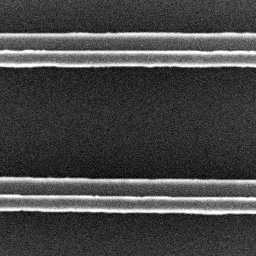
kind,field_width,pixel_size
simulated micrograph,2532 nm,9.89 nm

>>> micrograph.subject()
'lines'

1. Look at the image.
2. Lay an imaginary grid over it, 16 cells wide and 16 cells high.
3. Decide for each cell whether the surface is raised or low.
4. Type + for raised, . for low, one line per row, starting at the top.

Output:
................
................
++++++++++++++++
++++++++++++++++
................
................
................
................
................
................
................
++++++++++++++++
++++++++++++++++
................
................
................